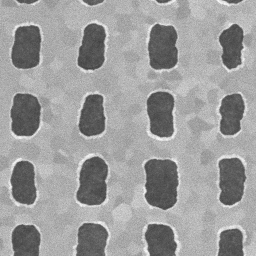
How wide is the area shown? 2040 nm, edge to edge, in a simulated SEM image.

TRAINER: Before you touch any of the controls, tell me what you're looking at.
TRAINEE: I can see a regular array of holes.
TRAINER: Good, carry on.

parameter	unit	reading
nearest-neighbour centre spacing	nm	533